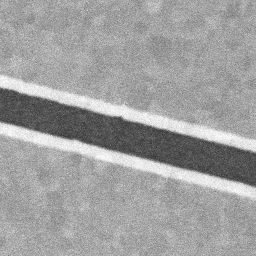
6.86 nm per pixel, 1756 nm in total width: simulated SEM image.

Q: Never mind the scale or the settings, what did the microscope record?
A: one or a few lines or trenches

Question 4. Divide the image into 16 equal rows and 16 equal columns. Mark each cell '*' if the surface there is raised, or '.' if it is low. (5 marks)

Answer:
****************
****************
****************
****************
****************
..**************
......**********
.........*******
**...........***
******..........
**********......
**************..
****************
****************
****************
****************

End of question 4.